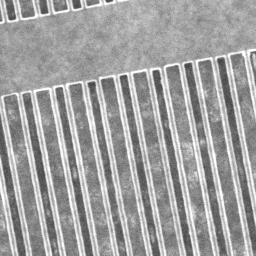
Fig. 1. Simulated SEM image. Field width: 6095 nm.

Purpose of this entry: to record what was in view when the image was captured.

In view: parallel lines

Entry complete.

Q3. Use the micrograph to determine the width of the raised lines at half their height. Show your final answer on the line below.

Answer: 117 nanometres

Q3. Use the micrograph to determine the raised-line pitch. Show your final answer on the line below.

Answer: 396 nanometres